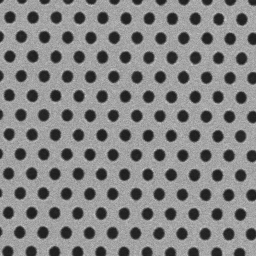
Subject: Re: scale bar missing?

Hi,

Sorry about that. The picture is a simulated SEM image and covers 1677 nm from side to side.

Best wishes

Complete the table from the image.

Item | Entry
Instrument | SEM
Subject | a regular array of holes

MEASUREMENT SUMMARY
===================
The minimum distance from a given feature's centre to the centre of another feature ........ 146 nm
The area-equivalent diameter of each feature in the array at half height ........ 81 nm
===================